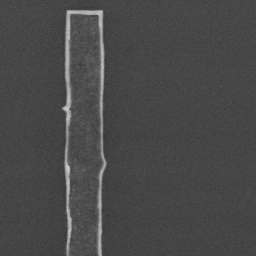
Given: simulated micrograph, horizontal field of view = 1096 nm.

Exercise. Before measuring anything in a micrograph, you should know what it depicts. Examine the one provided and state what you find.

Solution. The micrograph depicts one or a few lines or trenches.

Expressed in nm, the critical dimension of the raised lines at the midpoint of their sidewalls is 149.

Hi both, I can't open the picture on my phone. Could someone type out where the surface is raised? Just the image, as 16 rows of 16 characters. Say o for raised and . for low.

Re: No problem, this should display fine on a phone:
................
....oo..........
....oo..........
....oo..........
....oo..........
....oo..........
....oo..........
....oo..........
....oo..........
....oo..........
....oo..........
....oo..........
....oo..........
....oo..........
....oo..........
....oo..........